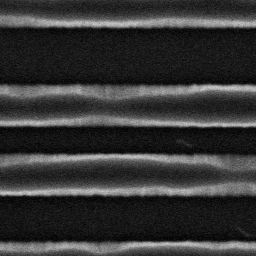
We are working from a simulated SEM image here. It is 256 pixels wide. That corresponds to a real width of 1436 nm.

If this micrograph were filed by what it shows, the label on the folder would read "lines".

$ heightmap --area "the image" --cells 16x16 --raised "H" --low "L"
HHHHHHHHHHHHHHHH
LLHHHHHHHHLHHHHH
LLLLLLLLLLLLLLLL
LLLLLLLLLLLLLLLL
LLLLLLLLLLLLLLLL
LLLLLLLLLLLLHHHH
HHHHHHHHHHHHHHHH
HHHHHHHHHHHHHHHH
LLLLLLLLLLLLLLLL
LLLLLLLLLLLLLLLL
HHHHHHHHHHHHHHHH
HHHHHHHHHHHHHHHH
LLLLLLLLLLLLLLLL
LLLLLLLLLLLLLLLL
LLLLLLLLLLLLLLLL
HHHHHHHHHHHHHHHH